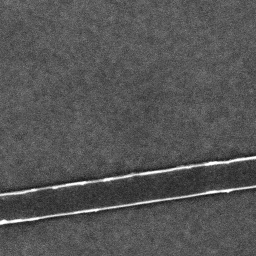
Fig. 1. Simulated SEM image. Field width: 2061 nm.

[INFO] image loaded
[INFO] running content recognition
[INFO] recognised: one or a few lines or trenches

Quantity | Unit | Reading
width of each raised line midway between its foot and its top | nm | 233